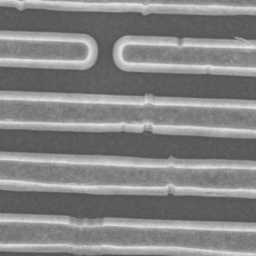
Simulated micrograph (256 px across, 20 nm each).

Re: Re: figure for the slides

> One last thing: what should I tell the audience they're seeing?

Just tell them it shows one or a few lines or trenches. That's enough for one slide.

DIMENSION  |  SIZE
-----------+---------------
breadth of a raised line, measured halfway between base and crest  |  0.569 µm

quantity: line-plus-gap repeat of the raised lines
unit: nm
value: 1220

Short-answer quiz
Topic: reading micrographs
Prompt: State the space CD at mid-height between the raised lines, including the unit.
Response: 643 nm